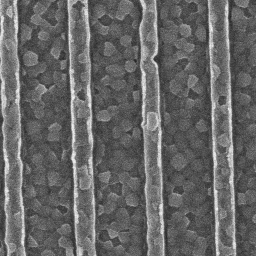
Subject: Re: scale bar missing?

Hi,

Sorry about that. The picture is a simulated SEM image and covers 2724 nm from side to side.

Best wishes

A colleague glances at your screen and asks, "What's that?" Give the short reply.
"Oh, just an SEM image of one or a few lines or trenches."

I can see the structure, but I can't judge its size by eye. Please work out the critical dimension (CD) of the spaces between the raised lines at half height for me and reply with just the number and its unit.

554 nm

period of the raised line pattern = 745 nm